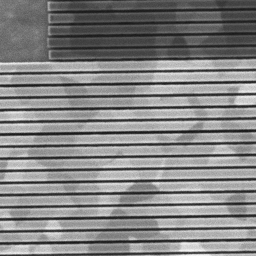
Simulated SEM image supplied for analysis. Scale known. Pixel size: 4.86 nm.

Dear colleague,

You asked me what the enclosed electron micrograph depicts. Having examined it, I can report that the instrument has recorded parallel lines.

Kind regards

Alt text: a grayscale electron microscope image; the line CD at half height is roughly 0.0437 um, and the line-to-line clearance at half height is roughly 17.6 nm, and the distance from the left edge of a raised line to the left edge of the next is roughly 0.059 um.